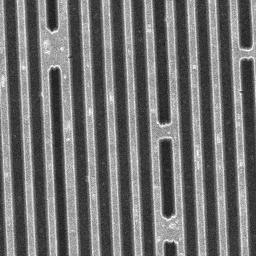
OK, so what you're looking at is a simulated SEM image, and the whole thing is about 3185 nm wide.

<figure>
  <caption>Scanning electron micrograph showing parallel lines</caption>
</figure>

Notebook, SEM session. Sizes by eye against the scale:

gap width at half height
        154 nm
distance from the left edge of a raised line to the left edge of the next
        0.265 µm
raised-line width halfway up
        112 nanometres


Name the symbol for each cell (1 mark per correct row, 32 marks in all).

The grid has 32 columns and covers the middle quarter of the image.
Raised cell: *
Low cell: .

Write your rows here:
*....**...**...***...**...**....
**...**...**....**...**...**....
**...**...**....**...**...**...*
**...**...**....**...**...**...*
**...**...**....**...**...**...*
**...**...**....**...**...**....
**...**...**....**...**...**....
**...**...**....**...**...***...
**...**....**...**...**....**...
**...**....**...**...**....**...
**...**....**...**...**....**...
**...**....**...**...**....**...
**...**....**...**...**....**...
**...**....**...**...**....**...
**...**....**...**...***...**...
**....**...**...**....*******...
**....**...**...**....*******...
**....**...**...**....*******...
**....**...**...**....*******...
**....**...**...**....**...**...
**....**...**...**....**...**...
**....**...**...**....**...**...
**....**...**....**...**...**...
***...**...**....**...**...**...
***...**...**....**...**...**...
***...**...**....**...**...**...
***...**...**....**...**...**...
***...**...**....**...**...**...
***...**...**....**...**...**...
***...**...**....**...**....**..
***...**....**...**...**....**..
***...**....**...**...**....**..